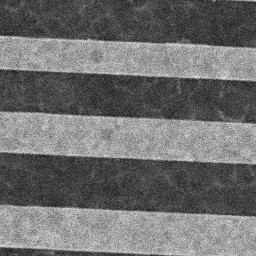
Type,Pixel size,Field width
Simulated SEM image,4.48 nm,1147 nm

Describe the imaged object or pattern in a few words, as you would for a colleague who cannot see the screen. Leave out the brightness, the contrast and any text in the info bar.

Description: one or a few lines or trenches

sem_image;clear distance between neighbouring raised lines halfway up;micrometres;0.215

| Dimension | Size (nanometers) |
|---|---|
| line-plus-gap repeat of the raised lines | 380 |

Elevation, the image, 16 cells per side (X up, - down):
----------------
----------------
XXXX------------
XXXXXXXXXXXXXXXX
-----XXXXXXXXXXX
----------------
----------------
XXXXXXXXXXX-----
XXXXXXXXXXXXXXXX
XXXXXXXXXXXXXXXX
----------------
----------------
----------------
XXXXXXXXXXXXXX--
XXXXXXXXXXXXXXXX
--XXXXXXXXXXXXXX